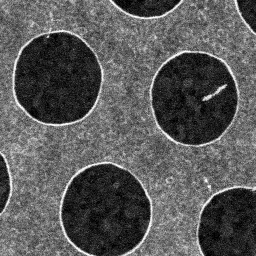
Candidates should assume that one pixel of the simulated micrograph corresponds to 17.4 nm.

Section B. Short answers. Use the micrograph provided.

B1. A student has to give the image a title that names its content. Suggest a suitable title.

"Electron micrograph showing raised bodies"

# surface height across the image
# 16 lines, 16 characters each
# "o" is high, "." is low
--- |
.......oooo....o
...............o
..ooo...........
.ooooo.....oo...
.ooooo....oooo..
.ooooo...oooooo.
.ooooo...oooooo.
..ooo.....ooooo.
..........oooo..
................
o....ooo........
o...ooooo.......
o...ooooo....ooo
....ooooo....ooo
....ooooo...oooo
.....ooo....oooo